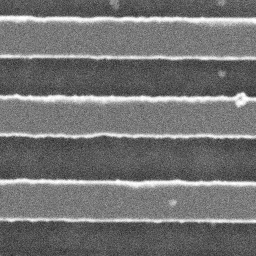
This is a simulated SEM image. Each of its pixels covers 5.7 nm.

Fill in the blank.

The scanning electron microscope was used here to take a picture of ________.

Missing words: lines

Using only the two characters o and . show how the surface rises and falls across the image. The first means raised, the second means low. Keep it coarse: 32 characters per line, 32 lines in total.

................................
................................
oooooooooooooooooooooooooooooooo
oooooooooooooooooooooooooooooooo
oooooooooooooooooooooooooooooooo
oooooooooooooooooooooooooooooooo
oooooooooooooooooooooooooooooooo
................................
................................
................................
................................
................................
oooooooooooooooooooooooooooooooo
oooooooooooooooooooooooooooooooo
oooooooooooooooooooooooooooooooo
oooooooooooooooooooooooooooooooo
oooooooooooooooooooooooooooooooo
................................
................................
................................
................................
................................
..o.............................
oooooooooooooooooooooooooooooooo
oooooooooooooooooooooooooooooooo
oooooooooooooooooooooooooooooooo
oooooooooooooooooooooooooooooooo
.o.ooo..oooooooooooooooooooooooo
................................
................................
................................
................................